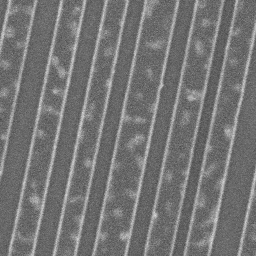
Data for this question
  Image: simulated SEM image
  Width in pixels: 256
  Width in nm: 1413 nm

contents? parallel lines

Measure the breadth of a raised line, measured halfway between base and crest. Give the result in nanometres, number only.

136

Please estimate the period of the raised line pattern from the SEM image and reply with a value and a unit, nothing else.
0.24 µm